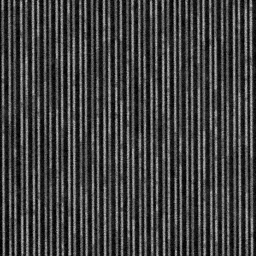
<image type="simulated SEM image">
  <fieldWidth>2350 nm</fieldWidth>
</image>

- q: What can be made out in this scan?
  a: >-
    parallel lines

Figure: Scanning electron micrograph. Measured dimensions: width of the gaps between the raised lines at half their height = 37.3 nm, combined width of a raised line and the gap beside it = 54.2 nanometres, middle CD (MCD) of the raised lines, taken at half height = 18.4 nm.